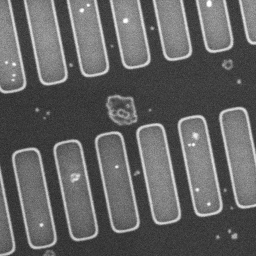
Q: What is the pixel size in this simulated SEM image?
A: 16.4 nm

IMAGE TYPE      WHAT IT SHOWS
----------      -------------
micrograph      groups of lines, slits or small figures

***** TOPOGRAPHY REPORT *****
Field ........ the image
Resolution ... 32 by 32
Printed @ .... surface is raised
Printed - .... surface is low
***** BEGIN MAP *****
-@@----@@---@@---@@----@@---@@--
-@@----@@---@@----@@---@@---@@--
--@@---@@---@@----@@---@@----@--
--@@---@@----@@---@@---@@----@@-
--@@---@@----@@---@@----@----@@-
--@@----@@---@@---@@----@@---@@@
--@@----@@---@@----@@---@@@@@@@@
---@@---@@---@@----@@@@@@@@@@@@@
---@@---@@---@@@@@@@@@@@@@@@@@@@
---@@---@@@@@@@@@@@@@@@@@@@@@@@@
---@@@@@@@@@@@@@@@@@@@@@@@@@@@@@
@@@@@@@@@@@@@@@@@@@@@@@@@@@@@@@@
@@@@@@@@@@@@@@@@@@@@@@@@@@@@@@@@
@@@@@@@@@@@@@@@@@@@@@@@@@@@@@@@@
@@@@@@@@@@@@@@@@@@@@@@@@@@@@---@
@@@@@@@@@@@@@@@@@@@@@@@---@@---@
@@@@@@@@@@@@@@@@@---@@----@@---@
@@@@@@@@@@@@---@@----@@---@@---@
@@@@@@@---@@---@@@---@@---@@----
@@---@@---@@----@@---@@---@@----
@@---@@---@@@---@@---@@----@@---
@@---@@----@@---@@---@@----@@---
@@---@@@---@@---@@----@@---@@---
@@----@@---@@---@@----@@---@@---
-@@---@@---@@----@@---@@---@@---
-@@---@@----@----@@---@@----@@--
-@@---@@----@@---@@---@@@--@@@@@
-@@----@@---@@---@@@--@@@@@@@@@@
-@@----@@---@@---@@@@@@@@@@@@@@@
--@----@@---@@@@@@@@@@@@@@@@@@@@
--@@--@@@@@@@@@@@@@@@@@@@@@@@@@@
-@@@@@@@@@@@@@@@@@@@@@@@@@@@@@@@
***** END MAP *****